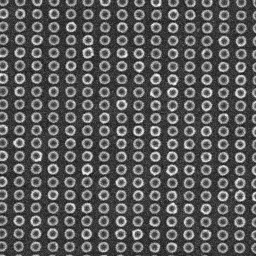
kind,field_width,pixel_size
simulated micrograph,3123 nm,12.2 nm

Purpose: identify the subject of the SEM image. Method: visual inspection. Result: a regular array of raised bodies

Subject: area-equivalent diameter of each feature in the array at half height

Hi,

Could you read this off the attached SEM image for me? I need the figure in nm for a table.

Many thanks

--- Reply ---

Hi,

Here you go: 118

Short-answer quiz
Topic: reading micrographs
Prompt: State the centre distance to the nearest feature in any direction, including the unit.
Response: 156 nanometers